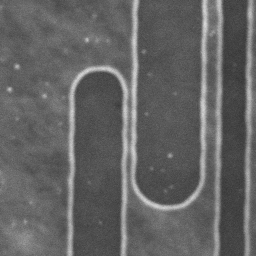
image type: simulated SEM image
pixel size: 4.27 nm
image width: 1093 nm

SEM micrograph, groups of lines, slits or small figures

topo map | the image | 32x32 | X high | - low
XXXXXXXXXXXXXXXXX---------X----X
XXXXXXXXXXXXXXXXX---------XX---X
XXXXXXXXXXXXXXXXX---------XX---X
XXXXXXXXXXXXXXXXX---------XX---X
XXXXXXXXXXXXXXXXX---------XX---X
XXXXXXXXXXXXXXXXX--------XXX---X
XXXXXXXXXXXXXXXXX--------XXX---X
XXXXXXXXXXXXXXXXX--------XX----X
XXXXXXXXXXXXXXXXX--------XX----X
XXXXXXXXXX-----XX--------XX----X
XXXXXXXXX------XX--------XX----X
XXXXXXXXX-------X--------XX----X
XXXXXXXXX-------X--------XX----X
XXXXXXXXX-------X--------XX----X
XXXXXXXXX-------X--------XX----X
XXXXXXXXX-------X--------XX----X
XXXXXXXXX-------X--------XX----X
XXXXXXXXX-------X--------XX----X
XXXXXXXXX-------X--------XX----X
XXXXXXXXX------XX--------XX----X
XXXXXXXXX------XX--------XX----X
XXXXXXXXX------XX--------XX----X
XXXXXXXXX-------X--------XX----X
XXXXXXXXX-------X--------XX----X
XXXXXXXXX-------XX------XXX----X
XXXXXXXXX------XXXX----XXXX----X
XXXXXXXXX------XXXXXXXXXXXX----X
XXXXXXXXX------XXXXXXXXXXXX----X
XXXXXXXXX------XXXXXXXXXXXX----X
XXXXXXXXX------XXXXXXXXXXXX----X
XXXXXXXXX------XXXXXXXXXXXX----X
XXXXXXXXX------XXXXXXXXXXXX----X